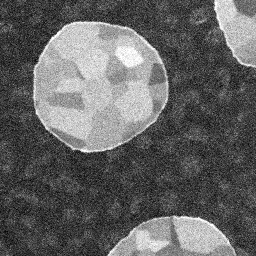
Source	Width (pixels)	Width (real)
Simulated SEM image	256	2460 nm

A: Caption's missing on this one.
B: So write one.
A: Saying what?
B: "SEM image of raised bodies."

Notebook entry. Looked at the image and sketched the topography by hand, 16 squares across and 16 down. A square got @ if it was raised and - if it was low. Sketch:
-------------@@@
----@@@-------@@
---@@@@@@-----@@
---@@@@@@@-----@
--@@@@@@@@------
--@@@@@@@@------
--@@@@@@@@------
---@@@@@@@------
---@@@@@--------
----------------
----------------
----------------
----------------
----------------
--------@@@@@@--
-------@@@@@@@@-